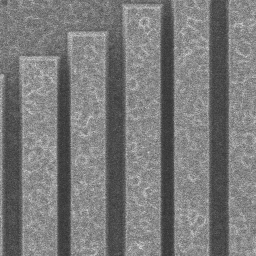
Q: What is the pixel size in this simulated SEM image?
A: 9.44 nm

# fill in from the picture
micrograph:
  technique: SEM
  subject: parallel lines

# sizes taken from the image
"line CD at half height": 345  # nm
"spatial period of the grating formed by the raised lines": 476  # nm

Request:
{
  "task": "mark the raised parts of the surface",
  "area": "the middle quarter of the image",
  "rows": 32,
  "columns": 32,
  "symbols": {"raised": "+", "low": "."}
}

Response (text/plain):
..++++++++.....+++++++++...+++++
..++++++++.....+++++++++...+++++
..++++++++.....+++++++++...+++++
..++++++++.....+++++++++...+++++
..++++++++.....+++++++++...+++++
..++++++++.....+++++++++...+++++
..++++++++.....+++++++++...+++++
..++++++++.....+++++++++...+++++
..++++++++.....+++++++++...+++++
..++++++++.....+++++++++...+++++
..++++++++.....+++++++++...+++++
..++++++++.....+++++++++...+++++
..++++++++.....+++++++++...+++++
..++++++++.....+++++++++...+++++
..++++++++.....+++++++++...+++++
..++++++++.....+++++++++...+++++
..++++++++.....+++++++++...+++++
..++++++++.....+++++++++...+++++
..++++++++.....+++++++++...+++++
..+++++++++....+++++++++...+++++
..+++++++++....+++++++++...+++++
..++++++++.....+++++++++...+++++
..++++++++.....+++++++++...+++++
..++++++++.....+++++++++...+++++
..++++++++.....+++++++++...+++++
..++++++++.....+++++++++...+++++
..++++++++.....+++++++++...+++++
..++++++++.....+++++++++...+++++
..++++++++.....+++++++++...+++++
..++++++++.....+++++++++...+++++
..++++++++.....+++++++++...+++++
..++++++++.....+++++++++...+++++